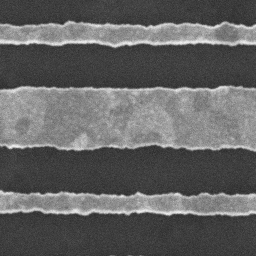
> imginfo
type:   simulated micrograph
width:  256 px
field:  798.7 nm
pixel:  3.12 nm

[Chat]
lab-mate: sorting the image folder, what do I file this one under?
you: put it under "lines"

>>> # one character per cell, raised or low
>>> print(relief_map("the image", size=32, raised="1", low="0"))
00000000000000000000000000000000
00000000000000000000000000000000
00000000000000000000000000000000
11111111111111111111111111111111
11111111111111111111111111111111
00100011000001111001101000001101
00000000000000000000000000000000
00000000000000000000000000000000
00000000000000000000000000000000
00000000000000000000000000000000
00000000000000000000000000000000
11111111111111111111111111111111
11111111111111111111111111111111
11111111111111111111111111111111
11111111111111111111111111111111
11111111111111111111111111111111
11111111111111111111111111111111
11111111111111111111111111111111
01100001111100011000001111111111
00000000000000000000000000000000
00000000000000000000000000000000
00000000000000000000000000000000
00000000000000000000000000000000
00000000000000000000000000000000
11111111111111101111111011111111
11111111111111111111111111111111
11000111111111111111111111111111
00000000000000000000000000000000
00000000000000000000000000000000
00000000000000000000000000000000
00000000000000000000000000000000
00000000000000000000000000000000